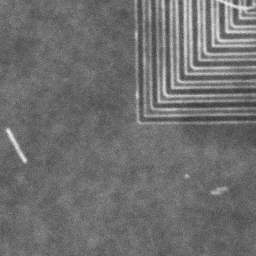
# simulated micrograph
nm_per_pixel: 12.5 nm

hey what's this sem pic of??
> groups of lines, slits or small figures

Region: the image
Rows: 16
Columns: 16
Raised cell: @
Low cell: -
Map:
@@@@@@@@@@@----@
@@@@@@@@@@@-----
@@@@@@@@@@@-----
@@@@@@@@@@@-----
@@@@@@@@@@------
@@@@@@@@@@-----@
@@@@@@@@@@@@@@@@
@@@@@@@@@@@@@@@@
@@@@@@@@@@@@@@@@
@@@@@@@@@@@@@@@@
@@@@@@@@@@@@@@@@
@@@@@@@@@@@@@@@@
@@@@@@@@@@@@@@@@
@@@@@@@@@@@@@@@@
@@@@@@@@@@@@@@@@
@@@@@@@@@@@@@@@@